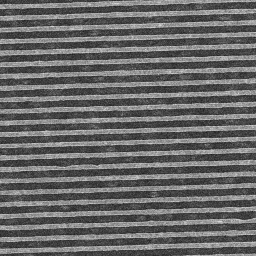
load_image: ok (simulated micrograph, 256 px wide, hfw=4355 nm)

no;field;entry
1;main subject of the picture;parallel lines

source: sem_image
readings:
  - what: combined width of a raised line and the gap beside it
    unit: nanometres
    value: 198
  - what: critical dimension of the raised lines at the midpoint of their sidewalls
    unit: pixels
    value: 4.12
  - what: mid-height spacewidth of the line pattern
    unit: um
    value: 0.13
